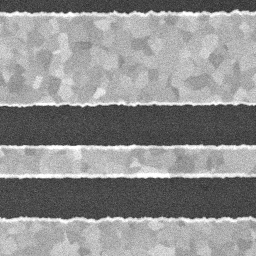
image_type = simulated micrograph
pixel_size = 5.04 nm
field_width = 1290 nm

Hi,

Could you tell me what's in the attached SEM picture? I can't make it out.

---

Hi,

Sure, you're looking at lines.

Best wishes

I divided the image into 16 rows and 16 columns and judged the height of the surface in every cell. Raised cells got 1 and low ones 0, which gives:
0000000000000000
1111111111111111
1111111111111111
1111111111111111
1111111111111111
1111111111111111
1111111111111111
0000000000000000
0000000000000000
1111111111111111
1111111111111111
0000000000000000
0000000000000000
0000000000000000
1111111111111111
1111111111111111